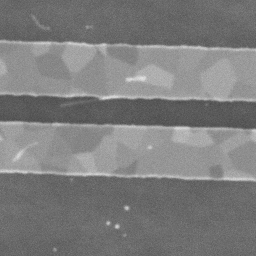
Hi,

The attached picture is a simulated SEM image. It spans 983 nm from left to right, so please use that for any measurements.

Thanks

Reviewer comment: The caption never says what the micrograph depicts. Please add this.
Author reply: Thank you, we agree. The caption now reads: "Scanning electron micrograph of lines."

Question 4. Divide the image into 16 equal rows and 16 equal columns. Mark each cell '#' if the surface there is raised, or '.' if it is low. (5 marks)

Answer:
................
................
................
################
################
################
................
................
################
################
################
................
................
................
................
................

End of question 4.